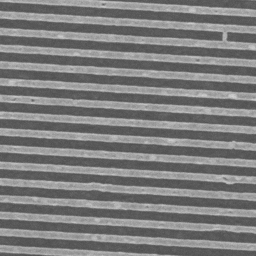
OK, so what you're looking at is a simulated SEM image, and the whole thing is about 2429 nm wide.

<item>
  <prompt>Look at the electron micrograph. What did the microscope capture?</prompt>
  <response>parallel lines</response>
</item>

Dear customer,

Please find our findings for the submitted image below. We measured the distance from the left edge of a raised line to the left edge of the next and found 158 nanometres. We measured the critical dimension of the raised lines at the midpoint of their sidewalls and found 64 nanometres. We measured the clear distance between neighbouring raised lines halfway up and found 92.4 nm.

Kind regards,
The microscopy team